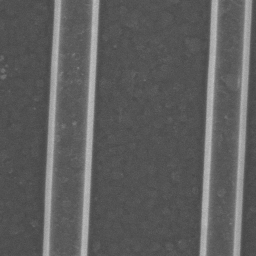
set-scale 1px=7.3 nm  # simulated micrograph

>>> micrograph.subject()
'one or a few lines or trenches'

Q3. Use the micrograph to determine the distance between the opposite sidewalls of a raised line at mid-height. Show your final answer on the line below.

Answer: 266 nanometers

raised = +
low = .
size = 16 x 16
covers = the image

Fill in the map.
....++.......+++
....++.......+++
...+++.......++.
...+++.......++.
...+++.......++.
...+++.......++.
...+++.......++.
...+++.......++.
...+++.......++.
...+++.......++.
...+++.......++.
...++........++.
...++........++.
...++........++.
...++........++.
...++........++.